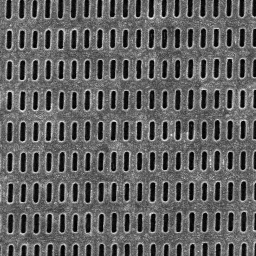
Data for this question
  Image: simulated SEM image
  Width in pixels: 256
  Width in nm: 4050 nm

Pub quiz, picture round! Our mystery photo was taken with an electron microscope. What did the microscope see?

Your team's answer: a regular array of holes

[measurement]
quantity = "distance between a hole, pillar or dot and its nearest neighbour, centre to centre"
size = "0.204 micrometres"